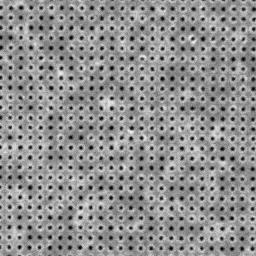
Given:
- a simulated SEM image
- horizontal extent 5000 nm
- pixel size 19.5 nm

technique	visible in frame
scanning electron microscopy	a regular array of holes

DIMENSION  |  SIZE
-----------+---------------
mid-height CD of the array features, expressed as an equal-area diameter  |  96.1 nanometers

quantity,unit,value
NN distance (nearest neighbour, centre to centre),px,9.78